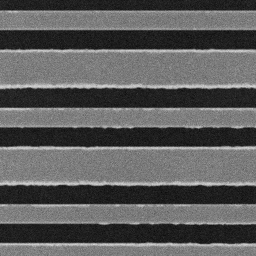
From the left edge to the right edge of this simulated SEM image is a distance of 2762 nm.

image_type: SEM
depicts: lines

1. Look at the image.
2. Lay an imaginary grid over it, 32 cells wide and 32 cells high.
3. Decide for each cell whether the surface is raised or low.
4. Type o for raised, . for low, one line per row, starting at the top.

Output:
................................
oooooooooooooooooooooooooooooooo
oooooooooooooooooooooooooooooooo
oooooooooooooooooooooooooooooooo
................................
................................
oooooooooooooooooooooooooooooooo
oooooooooooooooooooooooooooooooo
oooooooooooooooooooooooooooooooo
oooooooooooooooooooooooooooooooo
oooooooooooooooooooooooooooooooo
................................
................................
................................
oooooooooooooooooooooooooooooooo
oooooooooooooooooooooooooooooooo
................................
................................
oooooooooooooooooooooooooooooooo
oooooooooooooooooooooooooooooooo
oooooooooooooooooooooooooooooooo
oooooooooooooooooooooooooooooooo
oooooooooooooooooooooooooooooooo
................................
................................
................................
oooooooooooooooooooooooooooooooo
oooooooooooooooooooooooooooooooo
................................
................................
oooooooooooooooooooooo.oo.oo..oo
oooooooooooooooooooooooooooooooo